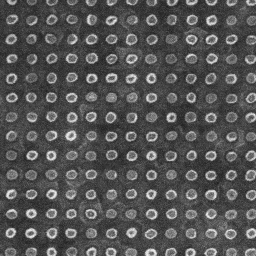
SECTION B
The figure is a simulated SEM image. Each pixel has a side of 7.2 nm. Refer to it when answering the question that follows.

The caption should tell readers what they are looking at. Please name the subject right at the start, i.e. a regular array of raised bodies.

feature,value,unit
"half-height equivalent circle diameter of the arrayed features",0.0722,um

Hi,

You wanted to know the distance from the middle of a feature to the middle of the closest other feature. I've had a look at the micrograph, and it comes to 137 nm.